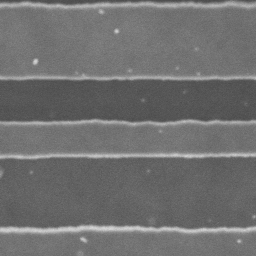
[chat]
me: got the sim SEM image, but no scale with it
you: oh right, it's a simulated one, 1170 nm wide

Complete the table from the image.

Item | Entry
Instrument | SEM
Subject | lines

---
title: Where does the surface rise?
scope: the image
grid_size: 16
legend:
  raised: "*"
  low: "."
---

****************
****************
****************
****************
****************
................
................
................
****************
****************
................
................
................
................
****************
****************